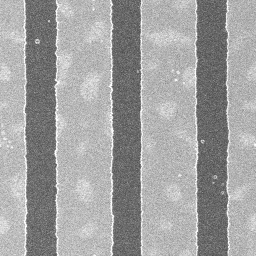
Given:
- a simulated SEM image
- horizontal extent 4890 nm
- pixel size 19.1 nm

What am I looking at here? one or a few lines or trenches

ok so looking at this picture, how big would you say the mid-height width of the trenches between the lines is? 1040 nm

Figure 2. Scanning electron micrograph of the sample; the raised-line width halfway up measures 31.3 pixels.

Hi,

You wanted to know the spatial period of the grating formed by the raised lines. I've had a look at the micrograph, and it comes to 85.5 pixels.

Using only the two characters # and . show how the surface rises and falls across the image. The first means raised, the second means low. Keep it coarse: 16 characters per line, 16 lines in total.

..##...##...##..
..##...##...##..
..##...##...##..
..##...##...##..
..##...##...##..
..##...##...##..
..##...##...##..
..##...##...##..
..##...##...##..
..##...##...##..
..##...##...##..
..##...##...##..
..##...##...##..
..##...##...##..
..##...##...##..
..##...##...##..